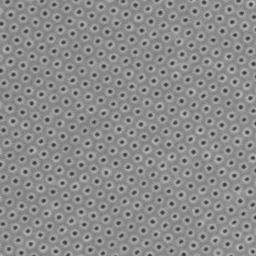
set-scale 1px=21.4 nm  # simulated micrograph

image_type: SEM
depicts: a regular array of holes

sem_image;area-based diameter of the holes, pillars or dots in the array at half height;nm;103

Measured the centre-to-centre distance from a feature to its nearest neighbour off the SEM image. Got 272 nm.